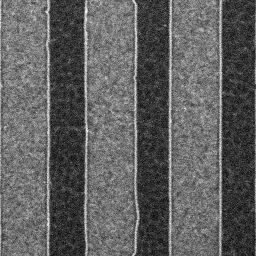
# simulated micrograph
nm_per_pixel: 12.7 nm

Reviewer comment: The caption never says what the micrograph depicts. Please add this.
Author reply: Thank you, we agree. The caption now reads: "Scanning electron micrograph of one or a few lines or trenches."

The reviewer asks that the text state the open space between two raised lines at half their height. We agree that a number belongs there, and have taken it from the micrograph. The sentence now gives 632 nm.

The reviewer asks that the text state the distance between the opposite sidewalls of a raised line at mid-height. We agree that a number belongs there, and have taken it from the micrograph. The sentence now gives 0.452 um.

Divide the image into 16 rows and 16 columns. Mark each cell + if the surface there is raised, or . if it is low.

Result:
...++...+++...++
...++...+++...++
...++....++...++
...++....++...++
...++...+++...++
...++...+++...++
...++...+++...++
...++...+++...++
...++....++...++
...++....++...++
...++...+++...++
...++...+++...++
...++....++...++
...++....++...++
...++....++...++
...++...+++...++